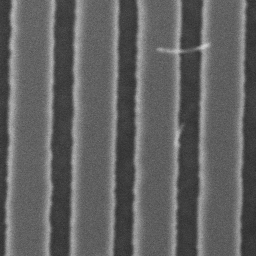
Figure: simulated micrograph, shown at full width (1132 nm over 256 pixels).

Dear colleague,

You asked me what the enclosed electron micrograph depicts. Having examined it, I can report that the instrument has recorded lines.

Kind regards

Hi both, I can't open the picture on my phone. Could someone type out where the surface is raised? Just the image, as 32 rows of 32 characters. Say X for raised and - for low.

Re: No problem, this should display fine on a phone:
-XXXXXX---XXXXX--XXXXXX--XXXXXX-
-XXXXXX--XXXXXX--XXXXXX--XXXXXX-
-XXXXXX--XXXXXX--XXXXXX--XXXXXX-
-XXXXXX--XXXXXX--XXXXXX--XXXXXX-
-XXXXXX--XXXXXX--XXXXX---XXXXXX-
-XXXXXX--XXXXXX--XXXXX---XXXXXX-
-XXXXXX--XXXXXX--XXXXX---XXXXXX-
-XXXXXX--XXXXXX--XXXXX---XXXXXX-
-XXXXXX--XXXXXX--XXXXX---XXXXX--
-XXXXXX--XXXXXX--XXXXX---XXXXXX-
-XXXXXX--XXXXXX--XXXXX---XXXXX--
-XXXXXX--XXXXXX--XXXXX---XXXXXX-
-XXXXXX--XXXXXX--XXXXX---XXXXXX-
-XXXXXX--XXXXX---XXXXX---XXXXX--
-XXXXXX--XXXXXX--XXXXX---XXXXX--
-XXXXXX--XXXXX---XXXXX---XXXXX--
-XXXXX---XXXXX---XXXXX---XXXXX--
-XXXXX---XXXXX---XXXXX---XXXXX--
-XXXXX---XXXXX---XXXXX---XXXXX--
-XXXXXX--XXXXX---XXXXX---XXXXX--
-XXXXX---XXXXX---XXXXX---XXXXX--
-XXXXX---XXXXX---XXXXX---XXXXX--
-XXXXX---XXXXX---XXXXX---XXXXX--
-XXXXXX--XXXXX---XXXXX---XXXXX--
-XXXXX---XXXXX---XXXXX---XXXXX--
-XXXXX---XXXXX---XXXXX---XXXXX--
-XXXXX---XXXXX---XXXXX---XXXXX--
-XXXXX---XXXXX---XXXXX---XXXXX--
-XXXXX---XXXXX---XXXXX---XXXXX--
-XXXXX---XXXXX---XXXXX---XXXXX--
-XXXXX---XXXXX---XXXXX---XXXXX--
-XXXXX---XXXXX---XXXXX---XXXXX--